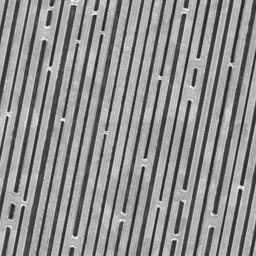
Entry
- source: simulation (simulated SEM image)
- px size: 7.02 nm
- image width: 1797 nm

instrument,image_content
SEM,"parallel lines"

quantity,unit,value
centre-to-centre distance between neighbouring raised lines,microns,0.0775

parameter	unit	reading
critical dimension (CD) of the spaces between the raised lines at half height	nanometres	33.6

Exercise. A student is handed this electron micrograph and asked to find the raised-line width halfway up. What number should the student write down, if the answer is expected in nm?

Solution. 47.4